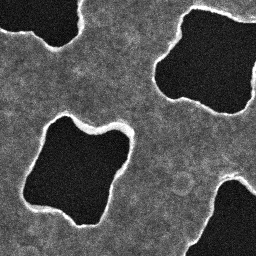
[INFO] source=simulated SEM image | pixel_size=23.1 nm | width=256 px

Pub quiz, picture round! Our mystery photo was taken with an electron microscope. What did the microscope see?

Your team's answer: holes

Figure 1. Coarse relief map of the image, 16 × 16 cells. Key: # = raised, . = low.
.....###########
.....######.....
###.#######.....
##########......
##########......
##########......
#############..#
################
###.....########
##......########
##......########
##.....#######.#
##.....######...
####..#######...
#############...
############....